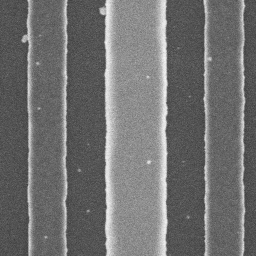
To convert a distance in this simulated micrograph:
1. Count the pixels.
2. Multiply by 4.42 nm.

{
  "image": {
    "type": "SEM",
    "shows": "lines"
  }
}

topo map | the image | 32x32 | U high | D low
DDDDUUUUDDDDDUUUUUUUUDDDDDUUUUDD
DDDDUUUUDDDDDUUUUUUUUDDDDDUUUUDD
DDDUUUUUDDDDDUUUUUUUUDDDDDUUUUDD
DDDUUUUUDDDDDUUUUUUUUDDDDDUUUUDD
DDDDUUUUDDDDDUUUUUUUUDDDDDUUUUDD
DDDDUUUUDDDDDUUUUUUUUDDDDDUUUUDD
DDDDUUUUDDDDDUUUUUUUUDDDDDUUUUDD
DDDDUUUUDDDDDUUUUUUUUDDDDDUUUUDD
DDDDUUUUDDDDDUUUUUUUUDDDDDUUUUDD
DDDDUUUUDDDDDUUUUUUUUDDDDDUUUUDD
DDDDUUUUDDDDDUUUUUUUUDDDDDUUUUDD
DDDDUUUUDDDDDUUUUUUUUDDDDDUUUUDD
DDDDUUUUDDDDDUUUUUUUUDDDDDUUUUUD
DDDDUUUUDDDDDUUUUUUUUDDDDDUUUUDD
DDDDUUUUDDDDDUUUUUUUUDDDDDUUUUDD
DDDDUUUUDDDDDDUUUUUUUDDDDDUUUUDD
DDDDUUUUDDDDDDUUUUUUUDDDDDUUUUDD
DDDDUUUUDDDDDUUUUUUUUDDDDDUUUUDD
DDDDUUUUDDDDDUUUUUUUUDDDDDUUUUDD
DDDDUUUUDDDDDUUUUUUUUDDDDDUUUUDD
DDDDUUUUDDDDDUUUUUUUUDDDDDUUUUDD
DDDDUUUUDDDDDUUUUUUUUDDDDDUUUUDD
DDDDUUUUDDDDDUUUUUUUUDDDDDUUUUDD
DDDDUUUUDDDDDUUUUUUUUDDDDDUUUUDD
DDDDUUUUDDDDDUUUUUUUUDDDDDUUUUDD
DDDDUUUUDDDDDUUUUUUUUDDDDDUUUUDD
DDDDUUUUDDDDDUUUUUUUUDDDDDUUUUUD
DDDDUUUUDDDDDUUUUUUUUDDDDDUUUUDD
DDDDUUUUDDDDDUUUUUUUUDDDDDUUUUDD
DDDDUUUUDDDDDUUUUUUUUDDDDDUUUUDD
DDDDUUUUDDDDDUUUUUUUUDDDDDUUUUDD
DDDDUUUUDDDDDDUUUUUUUDDDDDUUUUDD